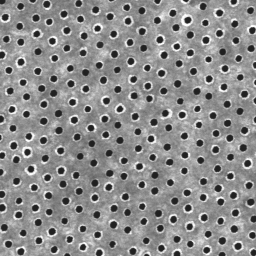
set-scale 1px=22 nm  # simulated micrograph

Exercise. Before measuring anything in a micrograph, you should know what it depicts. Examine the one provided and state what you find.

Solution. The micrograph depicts a regular array of holes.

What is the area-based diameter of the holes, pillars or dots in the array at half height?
155 nm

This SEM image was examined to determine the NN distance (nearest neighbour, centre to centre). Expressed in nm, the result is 342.